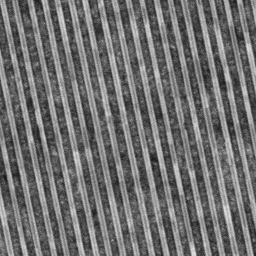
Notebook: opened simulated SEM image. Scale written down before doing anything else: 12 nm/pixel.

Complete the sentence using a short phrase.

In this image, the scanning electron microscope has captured parallel lines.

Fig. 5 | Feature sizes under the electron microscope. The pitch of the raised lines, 0.165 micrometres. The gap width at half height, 115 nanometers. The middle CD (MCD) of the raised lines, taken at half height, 0.0456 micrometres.